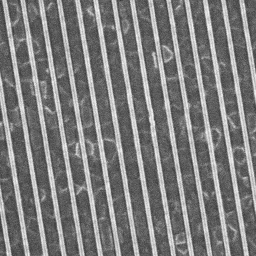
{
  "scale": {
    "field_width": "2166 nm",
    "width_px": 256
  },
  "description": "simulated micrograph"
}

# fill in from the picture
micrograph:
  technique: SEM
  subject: parallel lines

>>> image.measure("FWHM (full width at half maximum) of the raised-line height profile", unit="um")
0.022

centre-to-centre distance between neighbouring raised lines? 0.152 um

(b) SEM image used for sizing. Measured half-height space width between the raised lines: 0.13 microns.